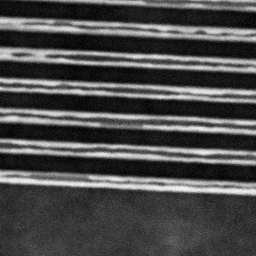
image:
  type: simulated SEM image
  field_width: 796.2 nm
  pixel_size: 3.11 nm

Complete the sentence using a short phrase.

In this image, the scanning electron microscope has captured parallel lines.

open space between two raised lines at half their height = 57.4 nanometers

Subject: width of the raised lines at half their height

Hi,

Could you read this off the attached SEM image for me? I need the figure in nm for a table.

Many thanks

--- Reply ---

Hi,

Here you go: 38.4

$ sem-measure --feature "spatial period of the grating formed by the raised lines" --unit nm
95